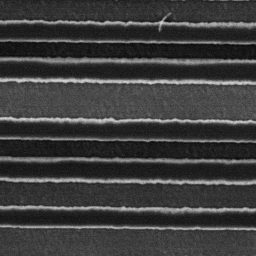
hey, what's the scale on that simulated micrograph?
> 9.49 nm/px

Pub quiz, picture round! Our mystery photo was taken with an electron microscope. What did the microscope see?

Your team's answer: lines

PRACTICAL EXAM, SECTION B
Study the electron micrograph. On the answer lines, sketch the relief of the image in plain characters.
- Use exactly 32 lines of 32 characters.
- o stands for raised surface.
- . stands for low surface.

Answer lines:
................................
................................
................................
oooooooooooooooooooooooooooooooo
oooooooooooooooooooooooooooooooo
................................
................................
ooooooooooooooooooooo...........
oooooooooooooooooooooooooooooooo
oooooooooooooooooooooooooooooooo
...........................ooooo
................................
................................
................................
................................
oooooooooooooooooooooooooooooooo
oooooooooooooooooooooooooooooooo
............oooooooooooooooooooo
................................
................................
oooooooooooooooooooooooooooooooo
oooooooooooooooooooooooooooooooo
oooooooooooooooooooooooooooooooo
................................
................................
................................
oooooooooooooooooooooooooooooooo
oooooooooooooooooooooooooooooooo
.........o....o.oooooooooooooooo
................................
................................
................................